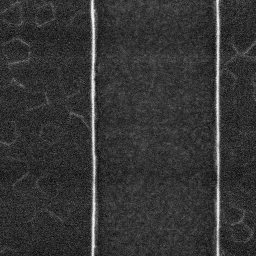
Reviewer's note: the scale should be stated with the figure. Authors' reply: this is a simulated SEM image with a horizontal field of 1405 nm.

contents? one or a few lines or trenches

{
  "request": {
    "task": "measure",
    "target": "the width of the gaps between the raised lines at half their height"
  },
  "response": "0.68 microns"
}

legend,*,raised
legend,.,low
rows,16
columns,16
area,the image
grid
******........**
******........**
******........**
******........**
******........**
******........**
******........**
******........**
******........**
******........**
******........**
******........**
******........**
******........**
******........**
******........**